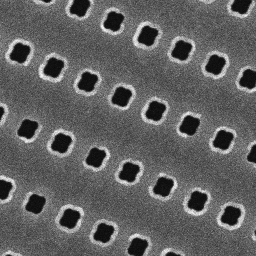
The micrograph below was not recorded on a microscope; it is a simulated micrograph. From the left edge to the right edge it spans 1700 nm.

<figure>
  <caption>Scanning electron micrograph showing a regular array of holes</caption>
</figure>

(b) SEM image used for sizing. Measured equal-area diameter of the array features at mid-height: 127 nm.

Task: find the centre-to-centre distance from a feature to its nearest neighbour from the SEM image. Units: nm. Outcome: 244